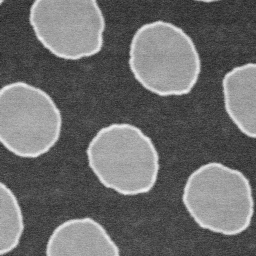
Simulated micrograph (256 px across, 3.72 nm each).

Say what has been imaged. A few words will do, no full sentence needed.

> raised bodies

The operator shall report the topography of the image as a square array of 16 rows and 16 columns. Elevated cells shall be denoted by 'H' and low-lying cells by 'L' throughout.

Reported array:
LLHHHHLLLLLLLLLL
LLHHHHLLLLLLLLLL
LLLHHHLLHHHHLLLL
LLLLHLLLHHHHLLLL
LLLLLLLLHHHHLLHH
HHLLLLLLLHHHLLHH
HHHLLLLLLLLLLLHH
HHHHLLLLLLLLLLLH
HHHHLLHHHLLLLLLL
LHHLLLHHHHLLLLLL
LLLLLLHHHHLLLHLL
LLLLLLLHHLLLHHHL
HLLLLLLLLLLLHHHH
HLLLLLLLLLLLHHHH
HLLHHHLLLLLLLLHL
HLLHHHHLLLLLLLLL